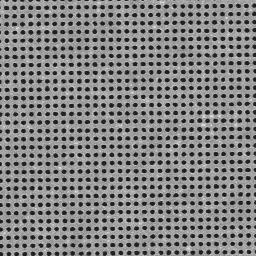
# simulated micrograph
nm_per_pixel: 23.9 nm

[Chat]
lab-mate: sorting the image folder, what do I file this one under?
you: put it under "a regular array of holes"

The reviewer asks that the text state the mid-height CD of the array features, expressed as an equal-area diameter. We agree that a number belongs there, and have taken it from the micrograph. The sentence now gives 0.121 um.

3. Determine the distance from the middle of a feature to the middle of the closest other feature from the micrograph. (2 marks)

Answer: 184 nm